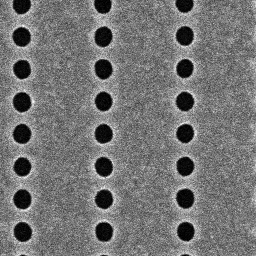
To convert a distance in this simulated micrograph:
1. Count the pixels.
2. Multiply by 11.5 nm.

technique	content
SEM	a regular array of holes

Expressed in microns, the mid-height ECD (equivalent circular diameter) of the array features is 0.22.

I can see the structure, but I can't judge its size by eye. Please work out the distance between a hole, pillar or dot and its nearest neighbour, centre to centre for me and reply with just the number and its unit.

371 nm